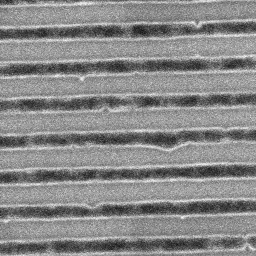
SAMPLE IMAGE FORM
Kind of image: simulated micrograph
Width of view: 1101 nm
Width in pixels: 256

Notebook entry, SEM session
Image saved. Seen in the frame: parallel lines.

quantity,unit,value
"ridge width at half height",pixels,15.2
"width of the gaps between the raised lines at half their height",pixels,20.6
